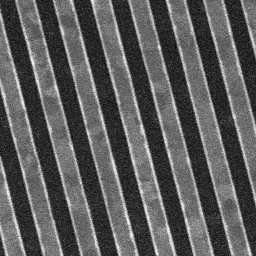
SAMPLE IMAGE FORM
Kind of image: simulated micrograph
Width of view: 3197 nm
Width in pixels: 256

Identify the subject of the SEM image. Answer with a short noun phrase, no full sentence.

parallel lines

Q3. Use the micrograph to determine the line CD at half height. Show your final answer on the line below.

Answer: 17.9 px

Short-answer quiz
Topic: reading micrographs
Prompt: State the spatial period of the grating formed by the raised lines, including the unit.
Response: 0.455 um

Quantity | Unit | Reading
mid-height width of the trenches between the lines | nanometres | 234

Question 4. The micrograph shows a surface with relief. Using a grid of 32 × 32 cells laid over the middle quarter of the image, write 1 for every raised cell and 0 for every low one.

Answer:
00111100000111110000011110000011
00111110000111110000011110000011
00111110000011110000011110000011
00111110000011110000011111000001
00011110000011111000001111000001
00011111000011111000001111000001
00011111000001111000001111100001
00011111000001111100001111100000
00001111000001111100000111100000
00001111100001111100000111110000
00001111100000111100000111110000
00000111100000111100000111110000
00000111100000111110000111110000
00000111110000111110000011110000
00000111110000011110000011111000
10000011110000011110000011111000
10000011110000011111000001111000
10000011110000001111000001111000
10000011111000001111000001111100
11000001111000001111100001111100
11000001111000001111100000111100
11000001111000000111100000111100
11000001111100000111100000111110
11100000111100000111110000111110
11100000111100000111110000011110
11100000111100000011110000011110
11100000111110000011110000011111
11110000011110000011111000001111
11110000011110000011111000001111
11110000011111000001111000001111
11110000011111000001111000001111
11111000001111000001111100000111